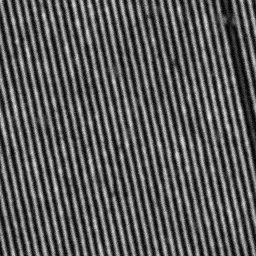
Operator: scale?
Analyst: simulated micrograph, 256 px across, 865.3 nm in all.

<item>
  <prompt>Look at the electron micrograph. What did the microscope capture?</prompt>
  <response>parallel lines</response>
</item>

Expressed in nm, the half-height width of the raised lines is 7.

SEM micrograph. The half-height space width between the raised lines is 0.0198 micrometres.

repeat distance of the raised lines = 26.5 nm